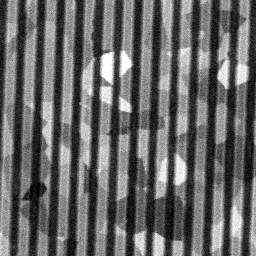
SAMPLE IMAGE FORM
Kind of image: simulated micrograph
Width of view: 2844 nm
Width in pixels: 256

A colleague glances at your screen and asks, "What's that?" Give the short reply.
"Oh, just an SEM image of parallel lines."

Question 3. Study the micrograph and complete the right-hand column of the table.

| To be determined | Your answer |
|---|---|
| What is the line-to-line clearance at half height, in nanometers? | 112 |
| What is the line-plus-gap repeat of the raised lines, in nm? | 215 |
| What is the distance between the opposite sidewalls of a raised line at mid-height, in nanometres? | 103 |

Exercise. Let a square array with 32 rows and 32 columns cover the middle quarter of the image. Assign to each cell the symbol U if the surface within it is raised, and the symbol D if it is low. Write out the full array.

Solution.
UUDDDUUDDDUUDDDUUDDUUUDDUUDDDUUD
UUDDDUUDDUUUDDDUUDDUUUDDUUDDDUUD
UUDDDUUDDUUUDDUUUDDUUDDDUUDDDUUD
UUDDDUUDDUUUDDUUUDDUUDDDUUDDDUUD
UUDDDUUDDDUUDDUUUDDUUDDDUUDDDUUD
UUDDDUUDDDUUDDUUUDDUUDDDUUDDDUUD
UUDDDUUDDDUUDDUUDDDUUDDDUUDDDUUD
UUDDDUUDDUUUDDUUDDDUUDDDUUDDDUUD
UUDDDUUDDUUUDDUUDDDUUDDDUUDDDUUD
UUDDUUUDDUUUDDUUDDDUUDDDUUDDDUUD
UUDDDUUDDUUDDDUUDDDUUDDDUUDDDUUD
UUDDUUUDDUUDDDUUDDDUUDDDUUDDDUUD
UUDDUUUDDUUDDDUUDDDUUDDDUUDDDUUD
UUDDUUUDDUUDDDUUDDDUUDDDUUDDDUUD
UUDDUUDDDUUDDDUUDDDUUDDDUUDDUUUD
UUDDUUDDDUUDDDUUDDDUUDDDUUDDUUUD
UUDDUUDDDUUDDDUUDDDUUDDDUUDDUUUD
UUDDUUDDDUUDDDUUDDDUUDDDUUDDUUUD
UDDDUUDDDUUDDDUUDDDUUDDUUUDDUUUD
UDDDUUDDDUUDDDUUDDDUUDDUUUDDUUUD
UDDDUUDDDUUDDDUUDDDUUDDUUUDDUUUD
UDDDUUDDDUUDDDUUDDDUUDDUUUDDUUUD
UDDDUUDDDUUDDDUUDDDUUDDUUUDDUUUD
UDDDUUDDDUUDDDUUDDDUUDDUUUDDUUDD
UDDDUUDDDUUDDDUUDDDUUDDUUUDDUUDD
UDDDUUDDDUUDDDUUDDDUUDDUUUDDUUDD
UDDDUUDDDUUDDDUUDDDUUDDUUDDDUUDD
UDDDUUDDDUUDDDUUDDDUUDDUUDDDUUDD
UDDDUUDDDUUDDDUUDDUUUDDUUDDDUUDD
UDDDUUDDDUUDDDUUDDUUUDDUUDDDUUDD
UDDDUUDDUUUDDDUUDDUUDDDUUDDDUUDD
UDDDUUDDDUUDDUUUDDUUDDDUUDDDUUDD